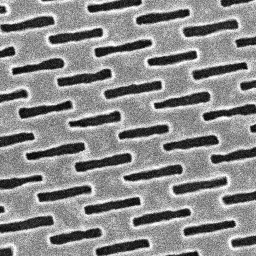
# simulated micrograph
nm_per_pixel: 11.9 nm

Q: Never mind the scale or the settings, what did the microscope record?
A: a regular array of holes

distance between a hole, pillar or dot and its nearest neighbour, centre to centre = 511 nanometres